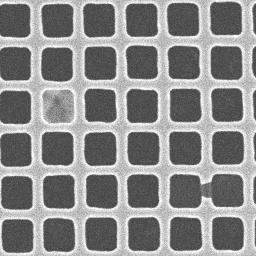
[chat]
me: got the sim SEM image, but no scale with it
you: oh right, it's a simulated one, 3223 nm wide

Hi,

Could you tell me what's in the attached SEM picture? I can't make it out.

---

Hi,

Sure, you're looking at a regular array of holes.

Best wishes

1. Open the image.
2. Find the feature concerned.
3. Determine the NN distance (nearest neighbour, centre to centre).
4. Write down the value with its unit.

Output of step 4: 528 nanometers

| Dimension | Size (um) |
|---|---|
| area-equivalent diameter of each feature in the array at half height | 0.46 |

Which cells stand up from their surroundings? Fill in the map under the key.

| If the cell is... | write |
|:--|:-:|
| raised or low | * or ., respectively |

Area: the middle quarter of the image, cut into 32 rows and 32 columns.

..***........***........**......
..***........***........**......
..***........***........**......
..***........***.......****.....
********************************
********************************
******......****.......****.....
*****........***.......***......
*****........***........**......
*****........***........**......
*****........***........**......
*****........***........**......
*****........***........**......
*****........***.......****.....
******..*...****.......****.....
********************************
********************************
..****.......***.......***......
..***........***........**......
...**........***........**......
...**........***........**......
...**........***........**......
...**........***........**......
...**........***........**......
..***........***........***.....
*******.....******...***********
********************************
*****************.....******...*
..****.......***........**......
...**.........*.........**......
...**.........**........**......
...**.........**........**......